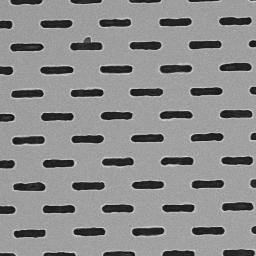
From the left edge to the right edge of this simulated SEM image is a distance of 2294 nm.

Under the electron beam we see a regular array of holes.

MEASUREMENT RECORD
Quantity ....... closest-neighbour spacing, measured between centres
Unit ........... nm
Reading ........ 333